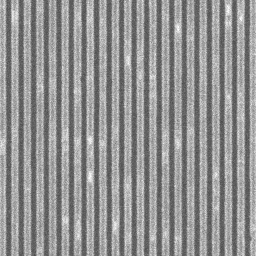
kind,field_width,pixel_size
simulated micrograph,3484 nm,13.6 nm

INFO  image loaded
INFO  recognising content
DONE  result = parallel lines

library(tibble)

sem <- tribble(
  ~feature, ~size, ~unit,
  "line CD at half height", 91.9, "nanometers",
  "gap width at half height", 78.3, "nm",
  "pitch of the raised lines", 171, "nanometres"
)